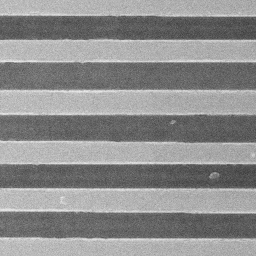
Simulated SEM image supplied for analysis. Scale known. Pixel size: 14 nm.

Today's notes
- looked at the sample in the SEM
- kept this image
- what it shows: lines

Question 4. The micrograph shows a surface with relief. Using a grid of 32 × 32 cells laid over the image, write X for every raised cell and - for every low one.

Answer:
XXXXXXXXXXXXXXXXXXXXXXXXXXXXXXXX
XXXXXXXXXXXXXXXXXXXXXXXXXXXXXXXX
--------------------------------
--------------------------------
--------------------------------
XXXXXXXXXXXXXXXXXXXXXXXXXXXXXXXX
XXXXXXXXXXXXXXXXXXXXXXXXXXXXXXXX
XXXXXXXXXXXXXXXXXXXXXXXXXXXXXXXX
--------------------------------
--------------------------------
--------------------------------
XXXXXXXXXXXXXXXXXXXXXXXXXXXXXXXX
XXXXXXXXXXXXXXXXXXXXXXXXXXXXXXXX
XXXXXXXXXXXXXXXXXXXXXXXXXXXXXXXX
--------------------------------
--------------------------------
--------------------------------
--------------------------------
XXXXXXXXXXXXXXXXXXXXXXXXXXXXXXXX
XXXXXXXXXXXXXXXXXXXXXXXXXXXXXXXX
--------------------------------
--------------------------------
--------------------------------
--------------------------------
XXXXXXXXXXXXXXXXXXXXXXXXXXXXXXXX
XXXXXXXXXXXXXXXXXXXXXXXXXXXXXXXX
-----------------------XXXXXXXXX
--------------------------------
--------------------------------
--------------------------------
XXXXXXXXXXXXXXXXXXXXXXXXXXXXXXXX
XXXXXXXXXXXXXXXXXXXXXXXXXXXXXXXX